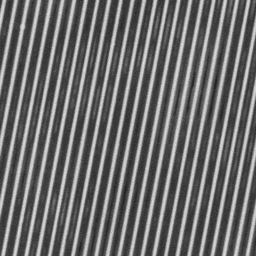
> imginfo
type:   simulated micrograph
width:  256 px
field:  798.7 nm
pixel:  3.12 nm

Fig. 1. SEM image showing parallel lines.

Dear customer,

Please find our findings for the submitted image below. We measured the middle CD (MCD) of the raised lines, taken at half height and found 11.5 nm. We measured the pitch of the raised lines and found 35.6 nanometers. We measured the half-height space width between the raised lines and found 23.8 nm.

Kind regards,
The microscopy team